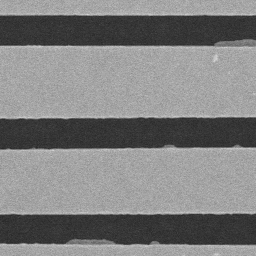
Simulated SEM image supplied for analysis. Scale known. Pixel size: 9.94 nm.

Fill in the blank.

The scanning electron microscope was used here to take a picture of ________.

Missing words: lines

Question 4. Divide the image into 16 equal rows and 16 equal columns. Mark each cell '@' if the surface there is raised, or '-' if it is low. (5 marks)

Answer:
@@@@@@@@@@@@@@@@
----------------
----------------
@@@@@@@@@@@@@@@@
@@@@@@@@@@@@@@@@
@@@@@@@@@@@@@@@@
@@@@@@@@@@@@@@@@
----------------
----------------
@@@@@@@@@@@@@@@@
@@@@@@@@@@@@@@@@
@@@@@@@@@@@@@@@@
@@@@@@@@@@@@@@@@
----------------
----------------
@@@@@@@@@@@@@@@@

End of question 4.